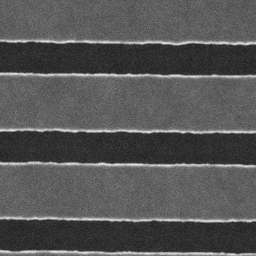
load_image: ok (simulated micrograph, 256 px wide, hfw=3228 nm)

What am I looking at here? lines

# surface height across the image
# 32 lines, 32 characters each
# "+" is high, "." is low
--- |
++++++++++++++++++++++++++++++++
++++++++++++++++++++++++++++++++
++++++++++++++++++++++++++++++++
++++++++++++++++++++++++++++++++
++++++++++++++++++++++++++++++++
.....................++......++.
................................
................................
................................
+++++++++++++++++++++++...++...+
++++++++++++++++++++++++++++++++
++++++++++++++++++++++++++++++++
++++++++++++++++++++++++++++++++
++++++++++++++++++++++++++++++++
++++++++++++++++++++++++++++++++
++++++++++++++++++++++++++++++++
.................++...++++++++++
................................
................................
................................
++++++++++..+...................
++++++++++++++++++++++++++++++++
++++++++++++++++++++++++++++++++
++++++++++++++++++++++++++++++++
++++++++++++++++++++++++++++++++
++++++++++++++++++++++++++++++++
++++++++++++++++++++++++++++++++
.............+++++++++++++++++++
................................
................................
................................
++++++++++......................